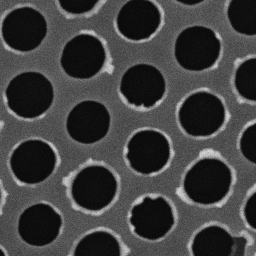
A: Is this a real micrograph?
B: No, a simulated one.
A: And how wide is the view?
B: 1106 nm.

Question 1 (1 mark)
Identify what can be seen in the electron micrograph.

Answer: a regular array of holes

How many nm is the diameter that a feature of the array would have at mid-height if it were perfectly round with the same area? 191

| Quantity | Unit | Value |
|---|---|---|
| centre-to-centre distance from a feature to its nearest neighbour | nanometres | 282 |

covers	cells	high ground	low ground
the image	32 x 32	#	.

########....####...####..####...
#....####..####.....########....
#.....#########.....#########...
......#########.....####..###...
......####..####...###.....#####
#....###.....#########......####
########.....#########.....#####
########.....#########.....####.
########.....###...####...####..
##....###...###.....#########...
#.....#########......########...
#......########......#########..
#......#########....###....####.
#.....###....##########.....####
###..####.....########......####
########......#########.....####
#########....#####..###....####.
####.####...####.....#########..
##....##########.....#########..
#......#########.....##########.
#......#########.....###....####
##.....###....###..#####.....###
###..####.....#########......###
#########......########......###
#########.....##########....###.
#####.####....###....####.#####.
###....##########....##########.
##......########......#########.
##.....##########....#####..####
###....####...####..####.....###
####..####.....#########.......#
#########......#########.......#